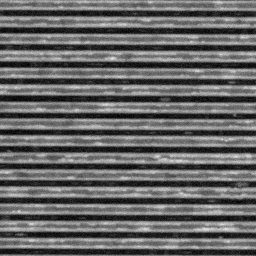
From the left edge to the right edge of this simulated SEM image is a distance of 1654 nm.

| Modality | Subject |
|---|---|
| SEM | parallel lines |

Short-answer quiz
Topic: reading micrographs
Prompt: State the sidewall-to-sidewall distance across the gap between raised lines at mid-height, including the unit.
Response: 56.5 nanometers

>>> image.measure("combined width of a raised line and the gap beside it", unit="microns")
0.11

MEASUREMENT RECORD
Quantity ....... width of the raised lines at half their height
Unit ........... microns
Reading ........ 0.0565